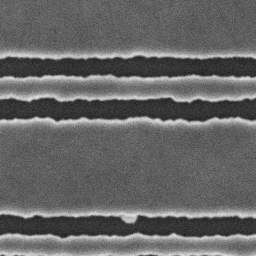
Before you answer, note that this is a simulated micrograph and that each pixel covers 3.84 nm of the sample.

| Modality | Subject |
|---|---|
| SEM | lines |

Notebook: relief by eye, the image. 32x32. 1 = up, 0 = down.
11111111111111111111111111111111
11111111111111111111111111111111
11111111111111111111111111111111
11111111111111111111111111111111
11111111111111111111111111111111
11111111111111111111111111111111
11111111111111111111111111111111
00000000000000000000000000000000
00000000000000000000000000000000
00000011100111000000000110100000
11111111111111111111111111111111
11111111111111111111111111111111
00110001100110000000001101111100
00000000000000000000000000000000
00000000000000000000000000000000
11111111111111111111111111111111
11111111111111111111111111111111
11111111111111111111111111111111
11111111111111111111111111111111
11111111111111111111111111111111
11111111111111111111111111111111
11111111111111111111111111111111
11111111111111111111111111111111
11111111111111111111111111111111
11111111111111111111111111111111
11111111111111111111111111111111
11111111111111111111111111111111
00000000000000000000000000000000
00000000000000000000000000000000
11111110001010101111011000010111
11111111111111111111111111111111
11111111111111111111111111111111